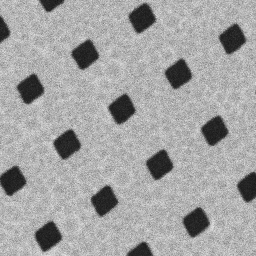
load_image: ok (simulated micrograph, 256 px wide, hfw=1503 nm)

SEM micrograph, a regular array of holes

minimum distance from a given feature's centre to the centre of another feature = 382 nm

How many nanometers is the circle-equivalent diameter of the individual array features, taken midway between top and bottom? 152